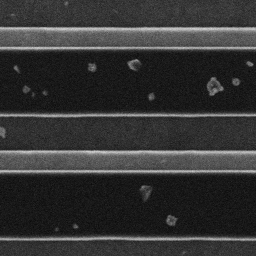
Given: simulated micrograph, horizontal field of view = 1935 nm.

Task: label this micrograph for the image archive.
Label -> lines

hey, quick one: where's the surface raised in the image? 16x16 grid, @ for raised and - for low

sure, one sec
----------------
----------------
@@@@@@@@@@@@@@@@
@@@@@@@@@@@@@@@@
@@@@@@@@@@@@@@@@
@@@@@@@@@@@@@@@@
@@@@@@@@@@@@@@@@
----------------
----------------
@@@@@@@-@@-@@---
@@@@@@@@@@@@@@@@
@@@@@@@@@@@@@@@@
@@@@@@@@@@@@@@@@
@@@@@@@@@@@@@@@@
@@@@@@@@@@@@@@@@
----------------